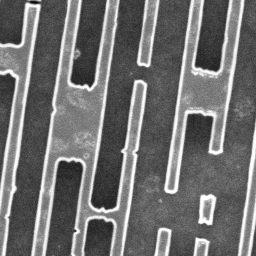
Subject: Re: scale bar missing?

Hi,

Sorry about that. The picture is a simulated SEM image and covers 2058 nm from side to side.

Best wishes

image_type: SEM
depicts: parallel lines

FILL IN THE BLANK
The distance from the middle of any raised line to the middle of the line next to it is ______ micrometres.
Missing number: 0.324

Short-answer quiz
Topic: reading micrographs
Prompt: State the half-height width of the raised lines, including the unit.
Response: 95.6 nanometers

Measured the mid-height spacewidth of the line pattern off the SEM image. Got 28 pixels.